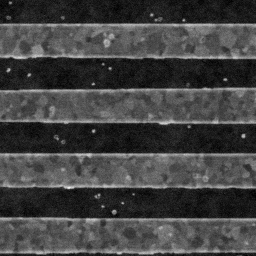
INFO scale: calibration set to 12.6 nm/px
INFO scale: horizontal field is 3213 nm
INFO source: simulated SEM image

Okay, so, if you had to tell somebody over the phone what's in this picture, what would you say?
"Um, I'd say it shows lines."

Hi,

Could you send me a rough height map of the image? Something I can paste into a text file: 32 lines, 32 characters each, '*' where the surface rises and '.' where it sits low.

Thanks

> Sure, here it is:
................................
................................
................................
********************************
********************************
********************************
********************************
................................
................................
................................
................................
********************************
********************************
********************************
********************************
................................
................................
................................
................................
********************************
********************************
********************************
********************************
................................
................................
................................
................................
********************************
********************************
********************************
********************************
..**............................